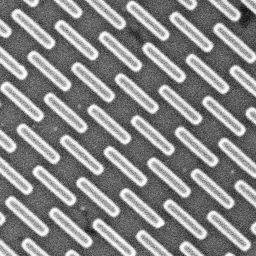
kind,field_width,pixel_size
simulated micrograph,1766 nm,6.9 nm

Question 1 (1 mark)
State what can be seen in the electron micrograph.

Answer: groups of lines, slits or small figures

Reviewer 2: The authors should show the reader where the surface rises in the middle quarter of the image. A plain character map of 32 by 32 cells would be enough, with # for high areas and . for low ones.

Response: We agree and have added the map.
...#............###.....####....
..###....................####...
...####...................####..
....####.....##............###..
#.....###....####...............
#......###....####..............
........###....####.....###.....
.........###.....###....####....
..........##......###....####...
...................###.....###..
.......#............###.....###.
#.....###............##......###
###....###....................##
####....###.......#............#
.####....###.....###............
..###.....###.....###...........
....#......####....####.....##..
............####....####....###.
#............###.....####....###
###............#......####....##
####...................####....#
.####......##............##.....
..####.....###..................
....###....####.................
.....###....####.....###........
......###.....###....####.......
.......##......###....####......
................###....####.....
.................###.....###....
....##............##......###...
....###....................###..
#....###....................###.